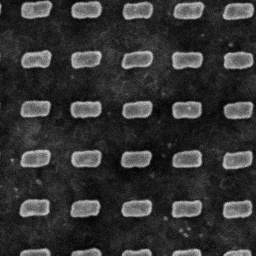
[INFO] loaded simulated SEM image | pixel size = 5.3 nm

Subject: a regular array of raised bodies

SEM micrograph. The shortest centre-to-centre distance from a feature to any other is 262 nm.